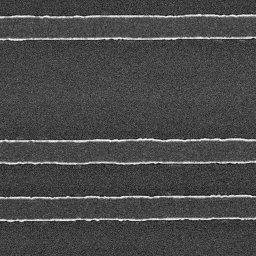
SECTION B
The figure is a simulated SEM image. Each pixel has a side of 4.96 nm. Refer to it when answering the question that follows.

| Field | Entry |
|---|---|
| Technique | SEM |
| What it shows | lines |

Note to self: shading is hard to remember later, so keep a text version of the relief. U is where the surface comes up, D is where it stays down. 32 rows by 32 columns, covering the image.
DDDDDDDDDDDDDDDDDDDDDDDDDDDDDDDD
DDDDDDDDDDDDDDDDDDDDDDDDDDDDDDDD
UUUUUUUUUUUUUUUUUUUUUUUUUUUUUUUU
UUUUUUUUUUUUUUUUUUUUUUUUUUUUUUUU
UUUUUUUUUUUUUUUUUUUUUUUUUUUUUUUU
DDDDDDDDDDDDDDDDDDDDDDDDDDDDDDDD
DDDDDDDDDDDDDDDDDDDDDDDDDDDDDDDD
DDDDDDDDDDDDDDDDDDDDDDDDDDDDDDDD
DDDDDDDDDDDDDDDDDDDDDDDDDDDDDDDD
DDDDDDDDDDDDDDDDDDDDDDDDDDDDDDDD
DDDDDDDDDDDDDDDDDDDDDDDDDDDDDDDD
DDDDDDDDDDDDDDDDDDDDDDDDDDDDDDDD
DDDDDDDDDDDDDDDDDDDDDDDDDDDDDDDD
DDDDDDDDDDDDDDDDDDDDDDDDDDDDDDDD
DDDDDDDDDDDDDDDDDDDDDDDDDDDDDDDD
DDDDDDDDDDDDDDDDDDDDDDDDDDDDDDDD
DDDDDDDDDDDDDDDDDDDDDDDDDDDDDDDD
DDDDDDDDDDDDDDDDDUDDDDDDDUUDUUUD
UUUUUUUUUUUUUUUUUUUUUUUUUUUUUUUU
UUUUUUUUUUUUUUUUUUUUUUUUUUUUUUUU
DDDDDDDDDDDDDDDDDDDDDDDDDDDDDDDD
DDDDDDDDDDDDDDDDDDDDDDDDDDDDDDDD
DDDDDDDDDDDDDDDDDDDDDDDDDDDDDDDD
DDDDDDDDDDDDDDDDDDDDDDDDDDDDDDDD
DDDDDDDDDDDDDDDDDDDDDDDDDDDDUUUU
UUUUUUUUUUUUUUUUUUUUUUUUUUUUUUUU
UUUUUUUUUUUUUUUUUUUUUUUUUUUUUUUU
UUUUUUUUUDUUUDDUUUUDDDDDDDDDDDDD
DDDDDDDDDDDDDDDDDDDDDDDDDDDDDDDD
DDDDDDDDDDDDDDDDDDDDDDDDDDDDDDDD
DDDDDDDDDDDDDDDDDDDDDDDDDDDDDDDD
DDDDDDDDDDDDDDDDDDDDDDDDDDDDDDDD